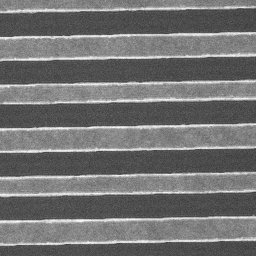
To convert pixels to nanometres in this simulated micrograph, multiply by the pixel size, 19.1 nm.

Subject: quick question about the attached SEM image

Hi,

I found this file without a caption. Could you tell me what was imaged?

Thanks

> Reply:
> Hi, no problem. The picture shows lines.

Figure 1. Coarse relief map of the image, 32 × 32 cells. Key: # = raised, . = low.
################################
##..............................
................................
................................
.........#######################
################################
################################
#...............................
................................
................................
............####################
################################
#####################...........
................................
................................
................................
################################
################################
################################
................................
................................
................................
################################
################################
................................
................................
................................
.............###################
################################
################################
########........................
................................